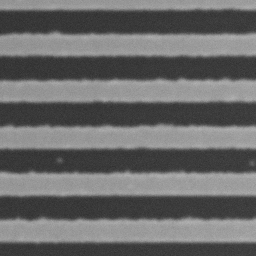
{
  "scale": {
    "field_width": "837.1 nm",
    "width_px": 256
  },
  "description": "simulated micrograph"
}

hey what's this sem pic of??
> lines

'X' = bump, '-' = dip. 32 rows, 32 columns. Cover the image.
XXXXXXXXXXXXXXXXXXXXXXXXXXXXXXXX
--------------------------------
--------------------------------
--------------------------------
XXXXXXXXXXXXXXXXXXXXXXXXXXXXXXXX
XXXXXXXXXXXXXXXXXXXXXXXXXXXXXXXX
XXXXXXXXXXXXXXXXXXXXXXXXXXXXXXXX
--------------------------------
--------------------------------
--------------------------------
XXXXXXXXXXXXXXXXXXXXXXXXXXXXXXXX
XXXXXXXXXXXXXXXXXXXXXXXXXXXXXXXX
XXXXXXXXXXXXXXXXXXXXXXXXXXXXXXXX
--------------------------------
--------------------------------
--------------------------------
XXXXXXXXXXXXXXXXXXXXXXXXXXXXXXXX
XXXXXXXXXXXXXXXXXXXXXXXXXXXXXXXX
XXXXXXXXXXXXXXXXX-XXXXXXXXXX-XXX
--------------------------------
--------------------------------
--------------------------------
XXXXXXXXXXXXXXXXXXXXXXXXXXXXXXXX
XXXXXXXXXXXXXXXXXXXXXXXXXXXXXXXX
--------------------------------
--------------------------------
--------------------------------
----------X------X---X--X----X--
XXXXXXXXXXXXXXXXXXXXXXXXXXXXXXXX
XXXXXXXXXXXXXXXXXXXXXXXXXXXXXXXX
--------------------------------
--------------------------------